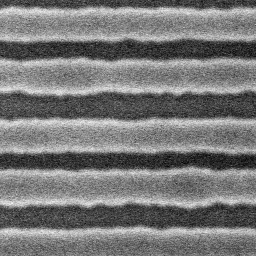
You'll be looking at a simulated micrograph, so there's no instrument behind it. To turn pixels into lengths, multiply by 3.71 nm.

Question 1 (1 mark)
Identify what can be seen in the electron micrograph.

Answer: lines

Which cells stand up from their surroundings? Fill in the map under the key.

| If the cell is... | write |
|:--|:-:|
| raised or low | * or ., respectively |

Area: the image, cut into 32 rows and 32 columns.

................................
********************************
********************************
********************************
********************************
................................
................................
......*****...............****..
********************************
********************************
********************************
...*********....**.*.**.*.****..
................................
................................
................................
********************************
********************************
********************************
********************************
................................
................................
*********.**********************
********************************
********************************
********************************
********..**.**...*.******......
................................
................................
.................*..............
********************************
********************************
********************************